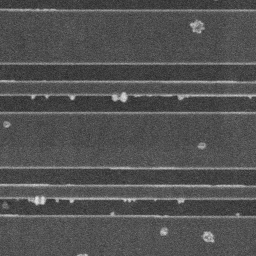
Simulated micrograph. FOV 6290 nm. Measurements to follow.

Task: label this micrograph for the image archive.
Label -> lines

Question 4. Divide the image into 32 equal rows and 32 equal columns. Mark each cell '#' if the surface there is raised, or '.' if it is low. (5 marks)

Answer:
................................
################################
################################
################################
################################
################################
################################
################################
................................
................................
################################
################################
..............##................
................................
################################
################################
################################
################################
################################
################################
################################
................................
................................
################################
################################
................................
................................
################################
################################
################################
################################
################################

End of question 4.